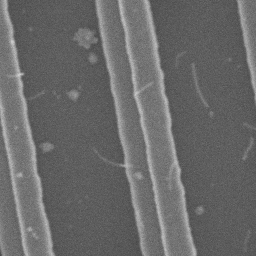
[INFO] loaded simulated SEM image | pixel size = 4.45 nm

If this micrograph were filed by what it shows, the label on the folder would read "lines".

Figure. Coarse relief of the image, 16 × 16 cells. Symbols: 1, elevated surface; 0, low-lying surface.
0000001110000001
1000001111000001
1000001111000001
1000000111000001
1000000111000000
1000000111000000
1100000111000000
1100000111100000
1100000011100000
1100000011100000
1100000011100000
1110000011100000
1110000011110000
1110000011110000
1110000001110000
1110000001110000